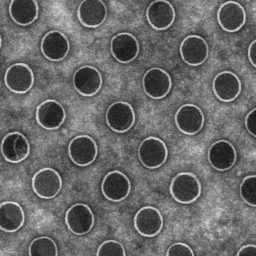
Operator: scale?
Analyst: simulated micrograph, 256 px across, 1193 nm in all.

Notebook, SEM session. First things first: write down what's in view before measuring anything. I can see a regular array of raised bodies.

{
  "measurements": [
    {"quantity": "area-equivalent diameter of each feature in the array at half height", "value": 136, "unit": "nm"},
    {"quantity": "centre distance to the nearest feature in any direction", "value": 224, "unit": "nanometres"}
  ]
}